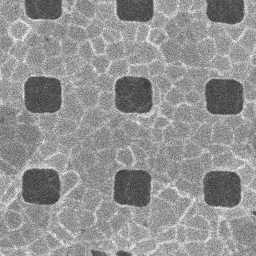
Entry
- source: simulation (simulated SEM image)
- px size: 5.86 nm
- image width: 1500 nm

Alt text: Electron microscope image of holes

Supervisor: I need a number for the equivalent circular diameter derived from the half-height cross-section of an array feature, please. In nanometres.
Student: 240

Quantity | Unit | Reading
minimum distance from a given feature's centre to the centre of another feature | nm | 530